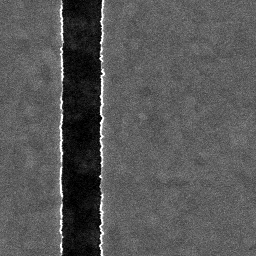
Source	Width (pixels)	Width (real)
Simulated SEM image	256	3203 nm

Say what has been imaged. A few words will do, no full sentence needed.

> one or a few lines or trenches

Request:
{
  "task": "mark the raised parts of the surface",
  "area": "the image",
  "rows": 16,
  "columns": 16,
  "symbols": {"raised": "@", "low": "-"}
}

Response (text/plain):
@@@@--@@@@@@@@@@
@@@@--@@@@@@@@@@
@@@@--@@@@@@@@@@
@@@@--@@@@@@@@@@
@@@@--@@@@@@@@@@
@@@@--@@@@@@@@@@
@@@@--@@@@@@@@@@
@@@@--@@@@@@@@@@
@@@@--@@@@@@@@@@
@@@@--@@@@@@@@@@
@@@@--@@@@@@@@@@
@@@@--@@@@@@@@@@
@@@@--@@@@@@@@@@
@@@@--@@@@@@@@@@
@@@@--@@@@@@@@@@
@@@@--@@@@@@@@@@